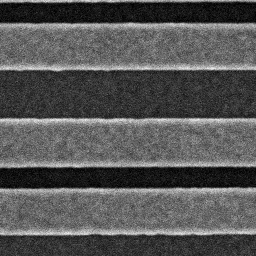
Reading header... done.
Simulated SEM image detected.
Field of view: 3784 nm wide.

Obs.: lines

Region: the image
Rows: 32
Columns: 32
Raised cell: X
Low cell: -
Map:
--------------------------------
--------------------------------
--------------------------------
XXXXXXXXXXXXXXXXXXXXXXXXXXXXXXXX
XXXXXXXXXXXXXXXXXXXXXXXXXXXXXXXX
XXXXXXXXXXXXXXXXXXXXXXXXXXXXXXXX
XXXXXXXXXXXXXXXXXXXXXXXXXXXXXXXX
XXXXXXXXXXXXXXXXXXXXXXXXXXXXXXXX
XXXXXXXXXXXXXXXXXXXXXXXXXXXXXXXX
--------------------------------
--------------------------------
--------------------------------
--------------------------------
--------------------------------
--------------------------------
XXXXXXXXXXXXXXXXXXXXXXXXXXXXXXXX
XXXXXXXXXXXXXXXXXXXXXXXXXXXXXXXX
XXXXXXXXXXXXXXXXXXXXXXXXXXXXXXXX
XXXXXXXXXXXXXXXXXXXXXXXXXXXXXXXX
XXXXXXXXXXXXXXXXXXXXXXXXXXXXXXXX
XXXXXXXXXXXXXXXXXXXXXXXXXXXXXXXX
--------------------------------
--------------------------------
--------------------------------
XXXXXXXXXXXXXXXXXXXXXXXXXXXXXXXX
XXXXXXXXXXXXXXXXXXXXXXXXXXXXXXXX
XXXXXXXXXXXXXXXXXXXXXXXXXXXXXXXX
XXXXXXXXXXXXXXXXXXXXXXXXXXXXXXXX
XXXXXXXXXXXXXXXXXXXXXXXXXXXXXXXX
--------------------------------
--------------------------------
--------------------------------